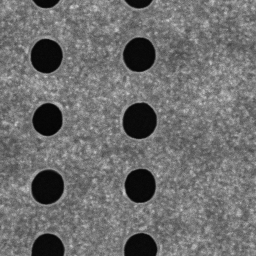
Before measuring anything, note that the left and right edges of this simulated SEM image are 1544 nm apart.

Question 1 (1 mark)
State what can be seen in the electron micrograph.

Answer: holes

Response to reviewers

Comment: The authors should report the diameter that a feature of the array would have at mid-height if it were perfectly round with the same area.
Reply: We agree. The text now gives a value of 201 nm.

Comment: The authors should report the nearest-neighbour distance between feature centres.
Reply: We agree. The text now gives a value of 391 nanometers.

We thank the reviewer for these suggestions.